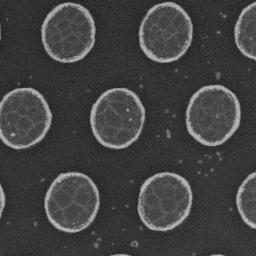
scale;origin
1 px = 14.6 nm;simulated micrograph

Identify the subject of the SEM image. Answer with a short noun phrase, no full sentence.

raised bodies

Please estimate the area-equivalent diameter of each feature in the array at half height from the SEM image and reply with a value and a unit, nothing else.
0.795 µm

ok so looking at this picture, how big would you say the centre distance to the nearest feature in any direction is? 1390 nm